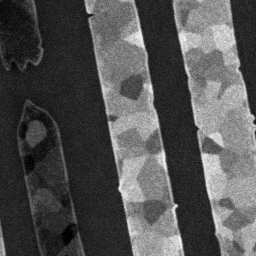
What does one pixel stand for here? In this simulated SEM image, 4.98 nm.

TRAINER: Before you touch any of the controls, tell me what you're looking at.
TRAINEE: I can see one or a few lines or trenches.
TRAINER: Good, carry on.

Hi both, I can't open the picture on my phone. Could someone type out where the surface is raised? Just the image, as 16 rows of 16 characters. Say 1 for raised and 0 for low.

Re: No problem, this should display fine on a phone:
1100011100011100
1100001110011110
1100001110011110
1110001110011110
0000001110001110
0000001110001110
0000000111001110
0110000111001111
0111000111001111
0111000111000111
0111000111000111
0011000111100111
0011000011100111
0011100011100111
0011100011100011
0011100011100011